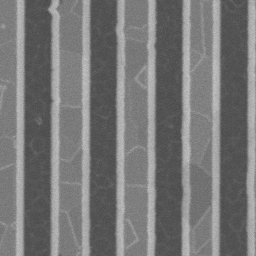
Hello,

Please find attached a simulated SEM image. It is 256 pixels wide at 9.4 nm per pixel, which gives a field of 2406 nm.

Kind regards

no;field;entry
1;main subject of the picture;one or a few lines or trenches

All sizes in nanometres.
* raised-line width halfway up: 278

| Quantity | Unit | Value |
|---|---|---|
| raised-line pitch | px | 65.3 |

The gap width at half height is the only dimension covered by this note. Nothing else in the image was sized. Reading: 337 nm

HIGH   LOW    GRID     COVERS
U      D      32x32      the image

UUDDDDDUUUUDDDDUUUUDDDDDUUUDDDDD
UUDDDDDUUUUDDDDUUUUDDDDUUUUDDDDD
UUDDDDDUUUUDDDDUUUUDDDDUUUUDDDDU
UUDDDDDUUUUDDDDUUUUDDDDUUUUDDDDU
UUDDDDDUUUUDDDDUUUUDDDDUUUUDDDDD
UUDDDDDUUUUDDDDUUUUDDDDUUUUDDDDD
UUDDDDDUUUUDDDDUUUUDDDDUUUUDDDDD
UUDDDDDUUUUDDDDUUUUDDDDUUUUDDDDD
UUDDDDDUUUUDDDDUUUUDDDDUUUUDDDDU
UUDDDDDUUUUDDDDUUUUDDDDUUUUDDDDD
UUDDDDDUUUUDDDDUUUUDDDDUUUUDDDDD
UUDDDDDUUUUDDDDUUUUDDDDUUUUDDDDD
UUDDDDDUUUUDDDDUUUUDDDDUUUUDDDDD
UUDDDDDUUUUDDDDUUUUDDDDUUUUDDDDD
UUDDDDDUUUUDDDDUUUUDDDDUUUUDDDDD
UUDDDDDUUUUDDDDUUUUDDDDUUUUDDDDD
UUDDDDDUUUUDDDDUUUUDDDDUUUUDDDDD
UUDDDDDUUUUDDDDUUUUDDDDUUUUDDDDD
UUDDDDDUUUUDDDDUUUUDDDDUUUUDDDDD
UUDDDDDUUUUDDDDUUUUDDDDUUUUDDDDD
UUDDDDDUUUUDDDDUUUUDDDDUUUUDDDDD
UUDDDDDUUUUDDDDUUUUDDDDUUUUDDDDD
UUDDDDDUUUUDDDDUUUUDDDDUUUUDDDDU
UUDDDDDUUUUDDDDUUUUDDDDUUUUDDDDU
UUDDDDDUUUUDDDDUUUUDDDDUUUUDDDDU
UUDDDDDUUUUDDDDUUUUDDDDUUUUDDDDU
UUDDDDDUUUUDDDDUUUUDDDDUUUUDDDDU
UUDDDDDUUUUDDDDUUUUDDDDUUUUDDDDU
UUDDDDDUUUUDDDDUUUUDDDDUUUUDDDDU
UUDDDDDUUUUDDDDUUUUDDDDUUUUDDDDU
UUDDDDDUUUUDDDDUUUUDDDDUUUUDDDDU
UUDDDDDUUUUDDDDUUUUDDDDUUUUDDDDU